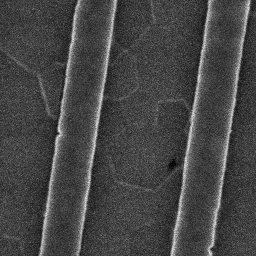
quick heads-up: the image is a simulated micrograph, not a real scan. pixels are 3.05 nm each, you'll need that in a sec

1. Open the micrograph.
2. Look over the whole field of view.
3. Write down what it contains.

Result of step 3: one or a few lines or trenches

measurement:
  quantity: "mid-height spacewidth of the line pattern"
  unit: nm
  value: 281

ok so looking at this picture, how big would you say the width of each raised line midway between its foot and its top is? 119 nm